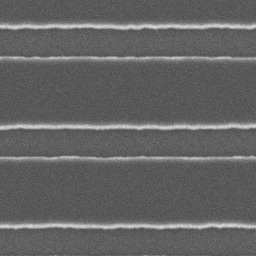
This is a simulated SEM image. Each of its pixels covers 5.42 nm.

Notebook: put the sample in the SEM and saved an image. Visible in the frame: lines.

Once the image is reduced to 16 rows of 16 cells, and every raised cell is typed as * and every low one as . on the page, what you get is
****************
****************
................
................
****************
****************
****************
****************
................
................
****************
****************
****************
****************
................
................